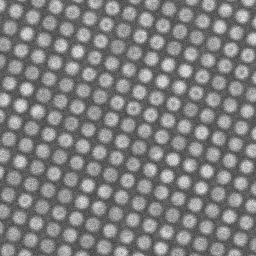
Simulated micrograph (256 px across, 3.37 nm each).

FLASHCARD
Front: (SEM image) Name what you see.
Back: a regular array of raised bodies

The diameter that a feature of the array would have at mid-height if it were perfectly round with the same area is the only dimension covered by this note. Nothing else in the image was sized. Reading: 13.1 pixels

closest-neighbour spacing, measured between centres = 59 nm